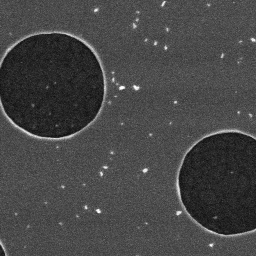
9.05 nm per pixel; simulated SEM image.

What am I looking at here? holes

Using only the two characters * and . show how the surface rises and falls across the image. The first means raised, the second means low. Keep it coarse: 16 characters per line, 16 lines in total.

****************
****************
*....***********
......**********
......**********
.......*********
......**********
*.....**********
**..*********...
************....
***********.....
***********.....
***********.....
************....
*************..*
****************